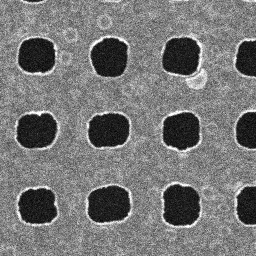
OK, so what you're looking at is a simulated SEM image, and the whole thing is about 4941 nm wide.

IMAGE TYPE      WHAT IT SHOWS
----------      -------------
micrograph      a regular array of holes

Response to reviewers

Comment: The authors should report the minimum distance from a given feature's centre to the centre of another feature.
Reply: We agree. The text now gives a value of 72.2 pixels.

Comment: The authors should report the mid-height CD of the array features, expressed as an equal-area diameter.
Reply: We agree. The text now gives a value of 0.763 um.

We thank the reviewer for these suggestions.